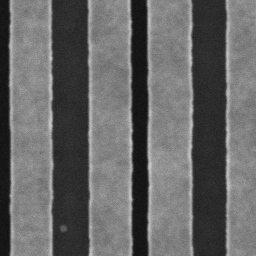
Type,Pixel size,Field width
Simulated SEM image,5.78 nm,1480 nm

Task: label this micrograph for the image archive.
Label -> lines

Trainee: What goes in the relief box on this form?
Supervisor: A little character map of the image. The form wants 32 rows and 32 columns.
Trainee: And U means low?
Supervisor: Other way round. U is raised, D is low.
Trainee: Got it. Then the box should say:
DUUUUUDDDDDUUUUUDDUUUUUUDDDDUUUU
DUUUUUDDDDDUUUUUDDDUUUUUDDDDUUUU
DUUUUUDDDDDUUUUUDDDUUUUUDDDDUUUU
DUUUUUDDDDDUUUUUDDDUUUUUDDDDUUUU
DUUUUUDDDDDUUUUUDDDUUUUUDDDDUUUU
DUUUUUDDDDDUUUUUDDDUUUUUDDDDUUUU
DUUUUUDDDDDUUUUUDDDUUUUUDDDDUUUU
DUUUUUDDDDDUUUUUDDDUUUUUDDDDUUUU
DUUUUUDDDDDUUUUUDDDUUUUUDDDDUUUU
DUUUUUDDDDDUUUUUDDDUUUUUDDDDUUUU
DUUUUUDDDDDUUUUUDDDUUUUUDDDDUUUU
DUUUUUDDDDDUUUUUDDDUUUUUDDDDUUUU
DUUUUUDDDDDUUUUUDDDUUUUUDDDDUUUU
DUUUUUDDDDDUUUUUDDDUUUUUDDDDUUUU
DUUUUUDDDDDUUUUUDDDUUUUUDDDDUUUU
DUUUUUDDDDDUUUUUUDDUUUUUDDDDUUUU
DUUUUUDDDDDUUUUUUDDUUUUUDDDDUUUU
DUUUUUDDDDDUUUUUUDDUUUUUDDDDUUUU
DUUUUUDDDDDUUUUUUDDUUUUUDDDDUUUU
DUUUUUDDDDDUUUUUUDDUUUUUDDDDUUUU
DUUUUUUDDDDUUUUUUDDUUUUUDDDDUUUU
DUUUUUUDDDDUUUUUUDDUUUUUDDDDUUUU
DUUUUUDDDDDUUUUUUDDUUUUUDDDDUUUU
DUUUUUUDDDDUUUUUDDDUUUUUDDDDUUUU
DUUUUUUDDDDUUUUUUDDUUUUUDDDDUUUU
DUUUUUDDDDDUUUUUUDDUUUUUDDDDUUUU
DUUUUUDDDDDUUUUUUDDUUUUUDDDDUUUU
DUUUUUDDDDDUUUUUDDDUUUUUDDDDUUUU
DUUUUUDDDDDUUUUUDDDUUUUUDDDDUUUU
DUUUUUDDDDDUUUUUUDDUUUUUDDDDUUUU
DUUUUUDDDDDUUUUUUDDUUUUUDDDDUUUU
DUUUUUDDDDDUUUUUUDDUUUUUDDDDUUUU